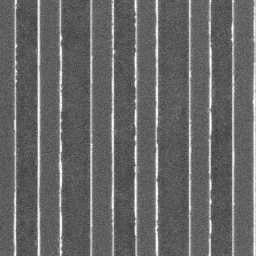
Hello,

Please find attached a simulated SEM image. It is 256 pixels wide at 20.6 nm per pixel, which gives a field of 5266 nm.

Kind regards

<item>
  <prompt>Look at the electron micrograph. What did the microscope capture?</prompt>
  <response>lines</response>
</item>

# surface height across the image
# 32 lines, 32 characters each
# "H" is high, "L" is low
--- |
HHLLLHHHLLLHHHLLLHHHLLLLHHLLLHHH
HHLLLHHHLLLHHHLLLHHHLLLLHHLLLHHH
HHLLLHHHLLLHHHLLLHHHLLLLHHLLLHHH
HHLLLHHHLLLHHHLLLHHHLLLLHHLLLHHH
HHLLLHHHLLLHHHLLLHHHLLLLHHLLLHHH
HHLLLHHHLLLHHHLLLHHHLLLLHHLLLHHH
HHLLLHHHLLLHHHLLLHHHLLLLHHLLLHHH
HHLLLHHHLLLHHHLLLHHHLLLLHHLLLHHH
HHLLLHHHLLLHHHLLLHHHLLLLHHLLLHHH
HHLLLHHHLLLHHHLLLHHHLLLLHHLLLHHH
HHLLLHHHLLLHHHLLLHHHLLLLHHLLLHHH
HHLLLHHHLLLHHHLLLHHHLLLLHHLLLHHH
HHLLLHHHLLLHHHLLLHHHLLLLHHLLLHHH
HHLLLHHHLLLHHHLLLHHHLLLLHHLLLHHH
HHLLLHHHLLLHHHLLLHHHLLLLHHLLLHHH
HHLLLHHHLLLHHHLLLHHHLLLLHHLLLHHH
HHLLLHHHLLLHHHLLLHHHLLLLHHLLLHHH
HHLLLHHHLLLHHHLLLHHHLLLLHHLLLHHH
HHLLLHHHLLLHHHLLLHHHLLLLHHLLLHHH
HHLLLHHHLLLHHHLLLHHHLLLLHHLLLHHH
HHLLLHHHLLLHHHLLLHHHLLLLHHLLLHHH
HHLLLHHHLLLHHHLLLHHHLLLLHHLLLHHH
HHLLLHHHLLLHHHLLLHHHLLLLHHLLLHHH
HHLLLHHHLLLHHHLLLHHHLLLLHHLLLHHH
HHLLLHHHLLLHHHLLLHHHLLLLHHLLLHHH
HHLLLHHHLLLHHHLLLHHHLLLLHHLLLHHH
HHLLLHHHLLLHHHLLLHHHLLLLHHLLLHHH
HHLLLHHHLLLHHHLLLHHHLLLLHHLLLHHH
HHLLLHHHLLLHHHLLLHHHLLLLHHLLLHHH
HHLLLHHHLLLHHHLLLHHHLLLLHHLLLHHH
HHLLLHHHLLLHHHLLLHHHLLLLHHLLLHHH
HHLLLHHHLLLHHHLLLHHHLLLLHHLLLHHH